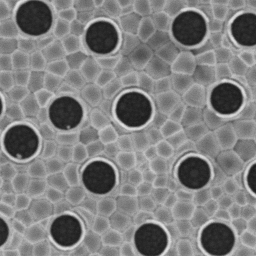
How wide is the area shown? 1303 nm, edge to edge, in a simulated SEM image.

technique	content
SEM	a regular array of holes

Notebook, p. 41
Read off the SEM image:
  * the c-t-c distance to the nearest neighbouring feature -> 347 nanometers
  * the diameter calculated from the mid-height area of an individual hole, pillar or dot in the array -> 174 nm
